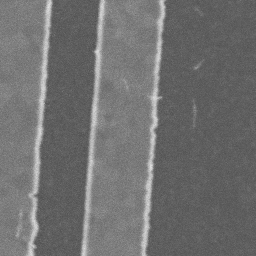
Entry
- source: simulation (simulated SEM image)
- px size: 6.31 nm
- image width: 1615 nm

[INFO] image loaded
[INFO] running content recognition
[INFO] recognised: one or a few lines or trenches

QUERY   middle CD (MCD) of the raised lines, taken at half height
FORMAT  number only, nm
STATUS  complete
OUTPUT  386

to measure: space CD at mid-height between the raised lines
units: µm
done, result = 0.327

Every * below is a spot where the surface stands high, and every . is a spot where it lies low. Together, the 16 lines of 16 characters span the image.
***...****......
***...****......
***...****......
***...****......
***...****......
***...****......
***...****......
***...****......
**....****......
**....****......
**....***.......
**....***.......
**...****.......
**...****.......
**...****.......
**...****.......